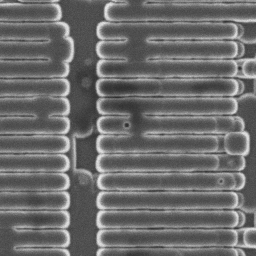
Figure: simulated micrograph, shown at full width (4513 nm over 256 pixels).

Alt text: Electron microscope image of wiring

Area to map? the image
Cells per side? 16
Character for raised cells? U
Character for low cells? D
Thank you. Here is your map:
UUUUDDDUUUUUUUUU
UUUUDDUUUUUUUUUD
UUUUDDUUUUUUUUUD
UUUUDDUUUUUUUUUD
UUUUDDUUUUUUUUUU
UUUUDDUUUUUUUUUD
UUUUDDUUUUUUUUUD
UUUUDDUUUUUUUUUD
UUUUDDUUUUUUUUUD
UUUUDDUUUUUUUUUD
UUUUDDUUUUUUUUUD
UUUUDDUUUUUUUUUD
UUUUDDUUUUUUUUUD
UUUUDDUUUUUUUUUD
UUUUDDUUUUUUUUUD
UUUUDDUUUUUUUUUD